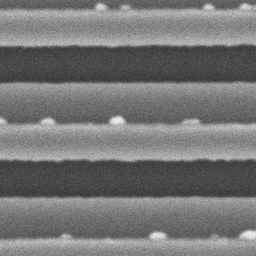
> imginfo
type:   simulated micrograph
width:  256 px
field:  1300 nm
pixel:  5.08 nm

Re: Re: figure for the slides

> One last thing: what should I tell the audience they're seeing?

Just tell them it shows lines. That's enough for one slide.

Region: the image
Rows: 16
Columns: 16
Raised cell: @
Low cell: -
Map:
@@@@@@@@@@@@@@@@
@@@@@@@@@@@@@@@@
@@@@@@@@@@@@@@@@
----------------
----------------
@@@@@@@@@@@@@@@@
@@@@@@@@@@@@@@@@
@@@@@@@@@@@@@@@@
@@@@@@@@@@@@@@@@
@@@@@@@@@@@@@@@@
----------------
----------------
@@@@@@@@@@@@@@@@
@@@@@@@@@@@@@@@@
@@@@@@@@@@@@@@@@
@@@@@@@@@@@@@@@@